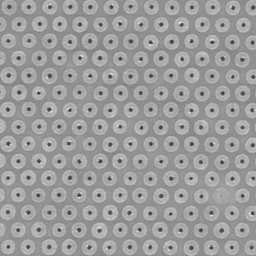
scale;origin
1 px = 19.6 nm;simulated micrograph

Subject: a regular array of ring-shaped raised bodies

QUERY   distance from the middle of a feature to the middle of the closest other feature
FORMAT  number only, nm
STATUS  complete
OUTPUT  380